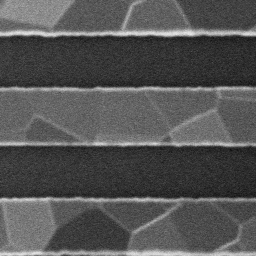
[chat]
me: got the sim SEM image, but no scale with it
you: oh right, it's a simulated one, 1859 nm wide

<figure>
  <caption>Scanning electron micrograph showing lines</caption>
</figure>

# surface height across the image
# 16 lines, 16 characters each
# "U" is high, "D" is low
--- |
UUUUUUUUUUUUUUUU
UUUUUUUUUUUUUUUU
DDDDDDDDDDDDDDDD
DDDDDDDDDDDDDDDD
DDDDDDDDDDDDDDDD
UDDUDDUDDUDDUUUU
UUUUUUUUUUUUUUUU
UUUUUUUUUUUUUUUU
UUUUUUUUUUUUUUUU
DDDDDDDDDDDDDDDD
DDDDDDDDDDDDDDDD
DDDDDDDDDDDDDDDD
UUUUUUUUUUUUUUUU
UUUUUUUUUUUUUUUU
UUUUUUUUUUUUUUUU
UUUUUUUUUUUUUUUU